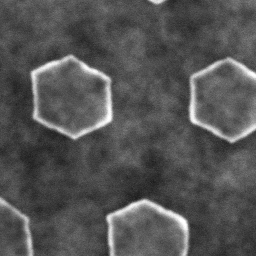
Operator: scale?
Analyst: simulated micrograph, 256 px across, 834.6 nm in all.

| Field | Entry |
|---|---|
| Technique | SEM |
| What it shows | raised bodies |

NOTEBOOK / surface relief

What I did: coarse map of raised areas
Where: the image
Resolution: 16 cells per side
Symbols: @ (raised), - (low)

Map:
----------------
----------------
----------------
----------------
--@@@@-------@@@
--@@@@@-----@@@@
--@@@@@-----@@@@
--@@@@@-----@@@@
----@---------@-
----------------
----------------
----------------
----------------
@------@@@@-----
@@-----@@@@@----
@@-----@@@@@----